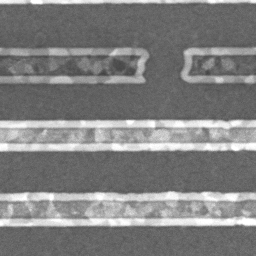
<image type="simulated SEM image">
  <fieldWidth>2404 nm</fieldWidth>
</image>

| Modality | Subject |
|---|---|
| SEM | one or a few lines or trenches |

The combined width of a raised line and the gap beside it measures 680 nanometers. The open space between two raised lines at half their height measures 467 nm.